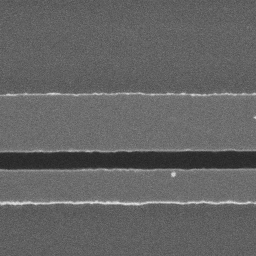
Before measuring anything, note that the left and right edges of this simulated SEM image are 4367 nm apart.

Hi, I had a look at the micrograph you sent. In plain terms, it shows lines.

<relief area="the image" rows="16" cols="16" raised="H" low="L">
LLLLLLLLLLLLLLLL
LLLLLLLLLLLLLLLL
LLLLLLLLLLLLLLLL
LLLLLLLLLLLLLLLL
LLLLLLLLLLLLLLLL
LLLLLLLLLLLLLLLL
HHHHHHHHHHHHHHHH
HHHHHHHHHHHHHHHH
HHHHHHHHHHHHHHHH
LLLLLLLLLLLLLLLL
LLLLLLLLLLLLLLLL
HHHHHHHHHHHHHHHH
HHHHHHHHHHHHHHHH
LLLLLLLLLLLLLLLL
LLLLLLLLLLLLLLLL
LLLLLLLLLLLLLLLL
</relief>